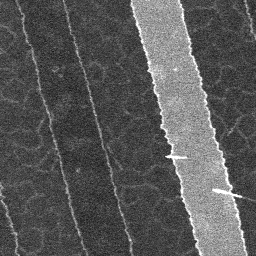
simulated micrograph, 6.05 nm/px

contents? one or a few lines or trenches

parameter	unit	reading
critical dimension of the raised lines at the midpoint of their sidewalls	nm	283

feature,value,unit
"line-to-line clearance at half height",382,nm